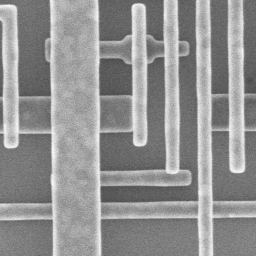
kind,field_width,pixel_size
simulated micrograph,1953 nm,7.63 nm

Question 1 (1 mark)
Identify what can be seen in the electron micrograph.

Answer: wiring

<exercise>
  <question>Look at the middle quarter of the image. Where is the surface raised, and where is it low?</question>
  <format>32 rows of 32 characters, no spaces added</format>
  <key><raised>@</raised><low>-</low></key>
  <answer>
@@@@@@@@@--------@@@@----@@@----
@@@@@@@@---------@@@@----@@@----
@@@@@@@@---------@@@@----@@@----
@@@@@@@@@--------@@@@----@@@----
@@@@@@@@@--------@@@@----@@@----
@@@@@@@@@--------@@@@----@@@----
@@@@@@@@@--------@@@@----@@@----
@@@@@@@@@--------@@@@----@@@----
@@@@@@@@@--------@@@-----@@@----
@@@@@@@@@--------@@@-----@@@----
@@@@@@@@@--------@@@-----@@@@---
@@@@@@@@@--------@@@-----@@@@---
@@@@@@@@@--------@@@-----@@@@---
@@@@@@@@@--------@@@-----@@@@---
@@@@@@@@@--------@@@@----@@@@---
@@@@@@@@@--------@@@@----@@@@---
@@@@@@@@@--------@@@@----@@@@---
@@@@@@@@@--------@@@@----@@@@---
@@@@@@@@@--------@@@@----@@@@---
@@@@@@@@@--------@@@-----@@@@---
@@@@@@@@@---------@@-----@@@@---
@@@@@@@@@-----------------@@@---
@@@@@@@@@-----------------@@----
@@@@@@@@@-----------------@@@---
@@@@@@@@@-----------------@@@---
@@@@@@@@@----------------@@@@---
@@@@@@@@@----------------@@@@---
@@@@@@@@@-----------------------
@@@@@@@@@-----------------------
@@@@@@@@@-----------------------
@@@@@@@@@-----------------------
@@@@@@@@@-----------------------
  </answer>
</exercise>